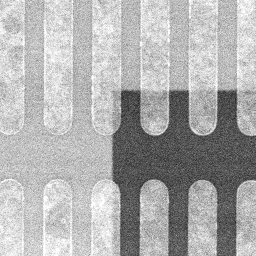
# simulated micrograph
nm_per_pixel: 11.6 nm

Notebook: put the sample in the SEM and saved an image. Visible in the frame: groups of lines, slits or small figures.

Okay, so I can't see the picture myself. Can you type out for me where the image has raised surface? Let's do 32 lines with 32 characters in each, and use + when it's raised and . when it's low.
+++...+++...+++...+++...+++...++
+++...+++...+++...+++...+++...++
+++...+++...+++...+++...+++...++
+++...+++...+++...+++...+++...++
+++...+++...+++...+++...+++...++
+++...+++...+++...+++...+++...++
+++...+++...+++...+++...+++...++
+++...+++...+++...+++...+++...++
+++...+++...+++...+++...+++...++
+++...+++...+++...+++...+++...++
+++...+++...+++...+++...+++...++
+++...+++...+++...+++...+++...++
+++...+++...+++...+++...+++...++
+++...+++...+++...+++...+++...++
+++...+++...+++...+++...+++...++
+++...+++...+++...+++...+++...++
++....++....++....++....++....++
................................
................................
................................
................................
................................
.......+........................
+++...+++...+++...+++...+++...++
+++...+++...+++...+++...+++...++
+++...+++...+++...+++...+++...++
+++...+++...+++...+++...+++...++
+++...+++...+++...+++...+++...++
+++...+++...+++...+++...+++...++
+++...+++...+++...+++...+++...++
+++...+++...+++...+++...+++...++
+++...+++...+++...+++...+++...++